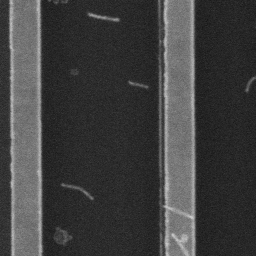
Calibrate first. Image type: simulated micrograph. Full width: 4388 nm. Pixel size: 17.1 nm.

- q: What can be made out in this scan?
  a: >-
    lines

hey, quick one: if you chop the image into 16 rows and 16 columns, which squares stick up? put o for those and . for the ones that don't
oo........oo....
oo........oo....
oo........oo....
oo........oo....
oo........oo....
oo........oo....
ooo.......oo....
ooo.......oo....
ooo.......oo....
ooo.......oo....
ooo.......oo....
ooo.......oo....
ooo.......oo....
ooo.......oo....
ooo.......oo....
ooo.......oo....